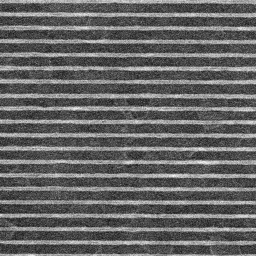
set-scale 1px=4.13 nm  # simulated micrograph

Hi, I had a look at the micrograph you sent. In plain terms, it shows parallel lines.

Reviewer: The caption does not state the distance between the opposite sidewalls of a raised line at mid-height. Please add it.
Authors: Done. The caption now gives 0.0139 um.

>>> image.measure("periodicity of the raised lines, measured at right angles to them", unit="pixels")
13.4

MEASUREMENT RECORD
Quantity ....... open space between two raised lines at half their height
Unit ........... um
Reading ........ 0.0418